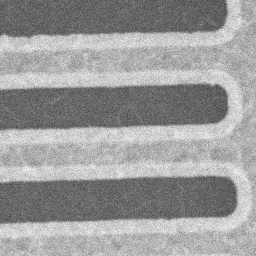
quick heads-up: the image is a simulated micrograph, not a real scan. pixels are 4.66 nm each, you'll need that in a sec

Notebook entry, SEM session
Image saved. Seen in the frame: one or a few lines or trenches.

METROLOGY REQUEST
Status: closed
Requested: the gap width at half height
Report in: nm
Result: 258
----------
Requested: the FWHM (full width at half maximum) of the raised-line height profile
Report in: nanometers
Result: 176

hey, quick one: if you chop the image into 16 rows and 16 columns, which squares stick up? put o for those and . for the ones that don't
...............o
...............o
..........oooooo
oooooooooooooooo
oooooooooooooooo
..............oo
...............o
..............oo
....oooooooooooo
oooooooooooooooo
oooooooooooooooo
...............o
...............o
...............o
oooooooooooooooo
oooooooooooooooo